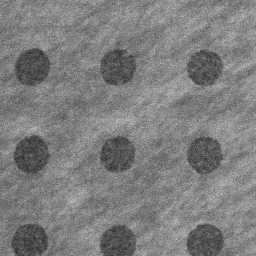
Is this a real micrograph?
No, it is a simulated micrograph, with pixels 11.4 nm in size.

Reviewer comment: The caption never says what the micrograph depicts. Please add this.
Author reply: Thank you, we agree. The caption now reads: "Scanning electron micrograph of raised bodies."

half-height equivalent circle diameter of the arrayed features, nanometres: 433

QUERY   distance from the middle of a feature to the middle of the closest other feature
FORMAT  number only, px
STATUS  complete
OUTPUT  85.9